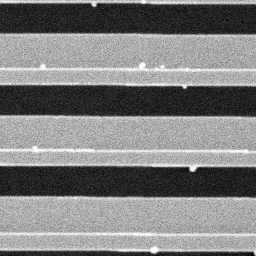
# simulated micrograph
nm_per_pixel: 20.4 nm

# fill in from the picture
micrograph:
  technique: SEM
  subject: lines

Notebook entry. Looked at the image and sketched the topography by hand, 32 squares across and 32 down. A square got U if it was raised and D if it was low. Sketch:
DDDDDDDDDDDUDDDDDDDDDDDDDDDDDDDD
DDDDDDDDDDDDDDDDDDDDDDDDDDDDDDDD
DDDDDDDDDDDDDDDDDDDDDDDDDDDDDDDD
DDDDDDDDDDDDDDDDDDDDDDDDDDDDDDDD
UUUUUUUUUUUUUUUUUUUUUUUUUUUUUUUU
UUUUUUUUUUUUUUUUUUUUUUUUUUUUUUUU
UUUUUUUUUUUUUUUUUUUUUUUUUUUUUUUU
UUUUUUUUUUUUUUUUUUUUUUUUUUUUUUUU
UUUUUUUUUUUUUUUUUUUUUUUUUUUUUUUU
UUUUUUUUUUUUUUUUUUUUUUUUUUUUUUUU
UUUUUUUUUUUUUUUUUUUUUUUUUUUUUUUU
DDDDDDDDDDDDDDDDDDDDDDDDDDDDDDDD
DDDDDDDDDDDDDDDDDDDDDDDDDDDDDDDD
DDDDDDDDDDDDDDDDDDDDDDDDDDDDDDDD
DDDDDDDDDDDDDDDDDDDDDDDDDDDDDDDD
UUUUUUUUUUUUUUUUUUUUUUUUUUUUUUUU
UUUUUUUUUUUUUUUUUUUUUUUUUUUUUUUU
UUUUUUUUUUUUUUUUUUUUUUUUUUUUUUUU
UUUUUUUUUUUUUUUUUUUUUUUUUUUUUUUU
UUUUUUUUUUUUUUUUUUUUUUUUUUUUUUUU
UUUUUUUUUUUUUUUUUUUUUUUUUUUUUUUU
DDDDDDDDDDDDDDDDDDDDDDDDDDDDDDDD
DDDDDDDDDDDDDDDDDDDDDDDDDDDDDDDD
DDDDDDDDDDDDDDDDDDDDDDDDDDDDDDDD
DDDDDDDDDDDDDDDDDDDDDDDDDDDDDDDD
UUUUUUUUUUUUUUUUUUUUUUUUUUUUUUUU
UUUUUUUUUUUUUUUUUUUUUUUUUUUUUUUU
UUUUUUUUUUUUUUUUUUUUUUUUUUUUUUUU
UUUUUUUUUUUUUUUUUUUUUUUUUUUUUUUU
UUUUUUUUUUUUUUUUUUUUUUUUUUUUUUUU
UUUUUUUUUUUUUUUUUUUUUUUUUUUUUUUU
DDDDDDDDDDDDDDDDDDDUDDDDDDDDDDDD